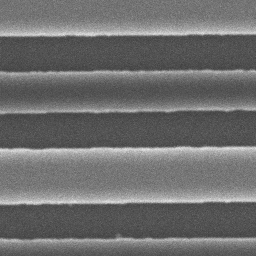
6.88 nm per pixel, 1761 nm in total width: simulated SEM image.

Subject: lines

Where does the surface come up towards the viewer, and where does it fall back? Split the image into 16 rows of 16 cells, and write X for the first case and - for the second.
XXXXXXXXXXXXXXXX
XXXXXXXXXXXXXXXX
----------------
----------------
------XXXXXXXXXX
XXXXXXXXXXXXXXXX
XXXXXXXXXXXXXXXX
----------------
----------------
XXXXXXXXXXXXXXXX
XXXXXXXXXXXXXXXX
XXXXXXXXXXXXXXXX
XXXXXXXXXXXXXXXX
----------------
----------------
XXXXXXXXXXXXXXXX